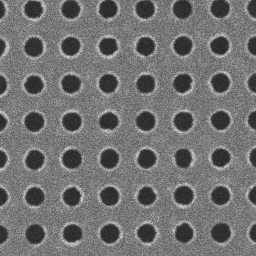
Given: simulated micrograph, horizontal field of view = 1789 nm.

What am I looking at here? a regular array of holes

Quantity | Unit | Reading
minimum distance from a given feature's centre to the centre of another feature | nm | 258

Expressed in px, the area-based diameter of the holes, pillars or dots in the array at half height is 19.1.